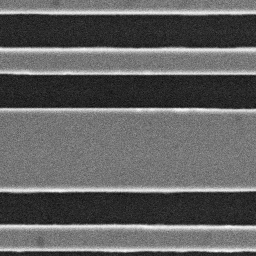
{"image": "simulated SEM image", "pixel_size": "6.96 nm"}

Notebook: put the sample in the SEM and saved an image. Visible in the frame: lines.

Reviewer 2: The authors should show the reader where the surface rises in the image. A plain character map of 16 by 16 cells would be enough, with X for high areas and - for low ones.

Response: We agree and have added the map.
XXXXXXXXXXXXXXXX
----------------
----------------
XXXXXXXXXXXXXXXX
XXXXXXXXXXXXXXXX
----------------
----------------
XXXXXXXXXXXXXXXX
XXXXXXXXXXXXXXXX
XXXXXXXXXXXXXXXX
XXXXXXXXXXXXXXXX
XXXXXXXXXXXXXXXX
----------------
----------------
XXXXXXXXXXXXXXXX
XXXXXXXXXXXXXXXX